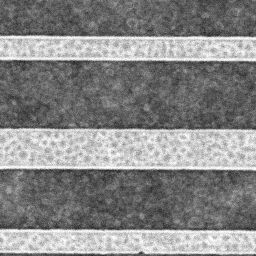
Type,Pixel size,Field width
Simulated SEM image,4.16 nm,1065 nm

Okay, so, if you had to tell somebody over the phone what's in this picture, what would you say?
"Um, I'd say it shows one or a few lines or trenches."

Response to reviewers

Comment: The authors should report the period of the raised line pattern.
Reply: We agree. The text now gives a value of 0.402 microns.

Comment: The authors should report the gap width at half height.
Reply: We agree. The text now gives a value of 279 nm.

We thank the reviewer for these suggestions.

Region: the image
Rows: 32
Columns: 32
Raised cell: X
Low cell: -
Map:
--------------------------------
--------------------------------
--------------------------------
--------------------------------
--------------------------------
XXXXXXXXXXXXXXXXXXXXXXXXXXXXXXXX
XXXXXXXXXXXXXXXXXXXXXXXXXXXXXXXX
--------------------------------
--------------------------------
--------------------------------
--------------------------------
--------------------------------
--------------------------------
--------------------------------
--------------------------------
--------------------------------
XXXXXXXXXXXXXXXXXXXXXXXXXXXXXXXX
XXXXXXXXXXXXXXXXXXXXXXXXXXXXXXXX
XXXXXXXXXXXXXXXXXXXXXXXXXXXXXXXX
XXXXXXXXXXXXXXXXXXXXXXXXXXXXXXXX
XXXXXXXXXXXXXXXXXXXXXXXXXXXXXXXX
--------------------------------
--------------------------------
--------------------------------
--------------------------------
--------------------------------
--------------------------------
--------------------------------
--------------------------------
XXXXXXXXXXXXXXXXXXXXXXXXXXXXXXXX
XXXXXXXXXXXXXXXXXXXXXXXXXXXXXXXX
---X----XXXXXX----X-XXXXXXXXXXXX